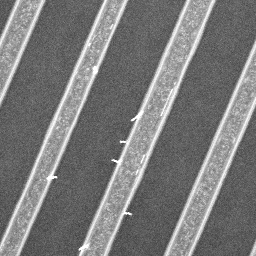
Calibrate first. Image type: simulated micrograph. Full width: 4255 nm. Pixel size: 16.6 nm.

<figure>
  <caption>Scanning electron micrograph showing one or a few lines or trenches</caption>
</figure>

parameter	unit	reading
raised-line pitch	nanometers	1310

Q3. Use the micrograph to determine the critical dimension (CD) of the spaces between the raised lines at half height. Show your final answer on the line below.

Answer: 937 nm